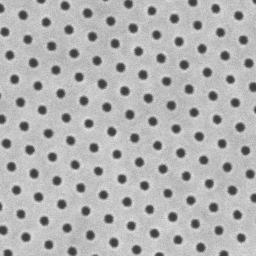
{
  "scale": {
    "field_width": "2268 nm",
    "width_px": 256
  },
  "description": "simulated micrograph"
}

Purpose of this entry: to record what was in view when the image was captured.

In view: a regular array of holes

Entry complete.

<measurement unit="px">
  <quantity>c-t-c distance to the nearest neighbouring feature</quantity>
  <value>23.7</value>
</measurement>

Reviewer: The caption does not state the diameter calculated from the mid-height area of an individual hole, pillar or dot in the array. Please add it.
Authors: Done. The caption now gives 91.7 nm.